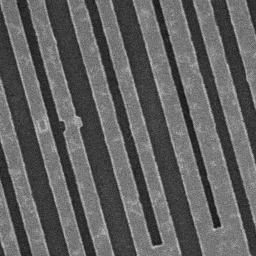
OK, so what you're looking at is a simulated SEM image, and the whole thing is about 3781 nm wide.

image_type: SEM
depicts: parallel lines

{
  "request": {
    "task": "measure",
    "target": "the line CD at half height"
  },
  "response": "237 nm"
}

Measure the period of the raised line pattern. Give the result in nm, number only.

466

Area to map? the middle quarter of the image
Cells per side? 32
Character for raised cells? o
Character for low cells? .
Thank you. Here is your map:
.....oooo...oooo......oooo...ooo
......oooo...oooo.....oooo...ooo
......oooo...oooo.....ooooo..ooo
......oooo...oooo......oooo..ooo
.......oooo...ooo......oooo...oo
o......oooo...oooo.....ooooo..oo
o......oooo...oooo......oooo..oo
oo.....ooooo..oooo......oooo..oo
oo.....ooooo...ooo......oooo..oo
oo......oooo...oooo.....ooooo..o
oo......oooo...oooo......oooo..o
ooo......oooo...ooo......oooo..o
ooo......oooo...oooo.....ooooo..
oooo.....oooo...oooo.....ooooo..
oooo.....oooo...oooo......oooo..
oooo......oooo...ooo......oooo..
oooo......oooo...oooo.....ooooo.
oooo......oooo...oooo......oooo.
oooo......ooooo...ooo......oooo.
.oooo.....ooooo...ooo......ooooo
.oooo......oooo...oooo.....ooooo
.oooo......oooo...oooo......oooo
..ooo.......oooo...ooo......oooo
..oooo......oooo...ooo......oooo
..oooo......oooo...oooo......ooo
..oooo......oooo...oooo......ooo
...oooo.....ooooo...ooo......ooo
...oooo......oooo...oooo.....ooo
...oooo......oooo...oooo......oo
...oooo......ooooo...ooo......oo
o..ooooo......oooo...ooo......oo
o...oooo......oooo...oooo.....oo